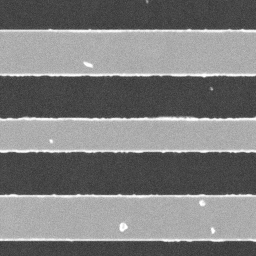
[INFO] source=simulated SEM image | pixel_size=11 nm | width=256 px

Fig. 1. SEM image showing lines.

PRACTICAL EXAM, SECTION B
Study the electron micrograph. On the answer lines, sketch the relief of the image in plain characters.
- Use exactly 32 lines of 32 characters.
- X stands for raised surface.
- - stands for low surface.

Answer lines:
--------------------------------
--------------------------------
--------------------------------
--------------------------------
XXXXXXXXXXXXXXXXXXXXXXXXXXXXXXXX
XXXXXXXXXXXXXXXXXXXXXXXXXXXXXXXX
XXXXXXXXXXXXXXXXXXXXXXXXXXXXXXXX
XXXXXXXXXXXXXXXXXXXXXXXXXXXXXXXX
XXXXXXXXXXXXXXXXXXXXXXXXXXXXXXXX
-------------------------X------
--------------------------------
--------------------------------
--------------------------------
--------------------------------
--------------------------------
XXXXXXXXXXXXXXXXXXXXXXXXXXXXXXXX
XXXXXXXXXXXXXXXXXXXXXXXXXXXXXXXX
XXXXXXXXXXXXXXXXXXXXXXXXXXXXXXXX
XXXXXXXXXXXXXXXXXXXXXXXXXXXXXXXX
--------------------------------
--------------------------------
--------------------------------
--------------------------------
--------------------------------
XXXXXXXXXXXXXXXXXXXXXXXXXXXXXXXX
XXXXXXXXXXXXXXXXXXXXXXXXXXXXXXXX
XXXXXXXXXXXXXXXXXXXXXXXXXXXXXXXX
XXXXXXXXXXXXXXXXXXXXXXXXXXXXXXXX
XXXXXXXXXXXXXXXXXXXXXXXXXXXXXXXX
XXXXXXXXXXXXXXXXXXXXXXXXXXXXXXXX
--------------------------------
--------------------------------